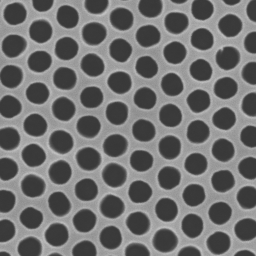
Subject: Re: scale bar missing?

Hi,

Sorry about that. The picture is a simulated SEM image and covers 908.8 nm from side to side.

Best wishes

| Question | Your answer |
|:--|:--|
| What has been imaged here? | a regular array of holes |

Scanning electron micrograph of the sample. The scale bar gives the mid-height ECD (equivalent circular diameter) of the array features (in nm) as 80.8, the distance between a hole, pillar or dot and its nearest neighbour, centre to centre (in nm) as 108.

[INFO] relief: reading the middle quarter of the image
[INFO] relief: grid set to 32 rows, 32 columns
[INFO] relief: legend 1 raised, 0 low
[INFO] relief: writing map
11110000001111111100000111111111
00111000001111111100000111111110
00011100011100001110000111001110
00011111111000000111001110000111
00011111111000000111111100000011
00111111111000000111111100000011
11111000011100001110001110000011
11110000001111111100000110000110
01110000001111111000000111111110
00110000011100111000000111111110
00011000011000001100000110001110
00011111110000001111111100000111
00011111110000001111111100000111
00110000111000001111111100000111
11100000011000011100001100000111
11100000011111111000000110001110
11100000011111111000000111111110
01110000111111111000000111111110
00111111111000011100001110001110
00111111110000001111111100000111
00111111110000001111111100000111
00110000110000011100111100000111
11100000011000111000011100000111
11100000011111110000001110001110
11100000011111110000001111111100
00110000111000111000001111111100
00111101110000011100011100001100
00111111110000001111111100000111
00111111110000001111111100000111
01110000110000011000111100000111
11100000111000110000011100001110
11100000111111110000001111111100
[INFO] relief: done